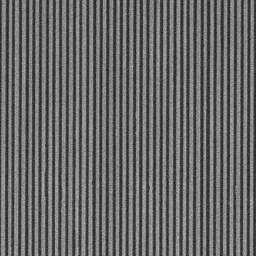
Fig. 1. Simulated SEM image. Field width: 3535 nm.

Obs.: parallel lines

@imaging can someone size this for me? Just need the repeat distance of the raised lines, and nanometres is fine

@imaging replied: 92.8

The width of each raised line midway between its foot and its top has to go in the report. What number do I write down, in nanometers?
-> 48.3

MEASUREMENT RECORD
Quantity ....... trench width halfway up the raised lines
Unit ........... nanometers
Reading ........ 48.3